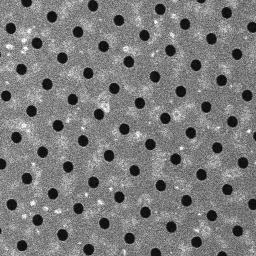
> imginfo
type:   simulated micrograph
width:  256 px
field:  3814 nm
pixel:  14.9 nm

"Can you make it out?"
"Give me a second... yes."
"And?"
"a regular array of holes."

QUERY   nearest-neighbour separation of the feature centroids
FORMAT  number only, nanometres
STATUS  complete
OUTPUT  441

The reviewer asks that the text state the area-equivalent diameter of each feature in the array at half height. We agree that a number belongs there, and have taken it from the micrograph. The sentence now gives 0.168 µm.